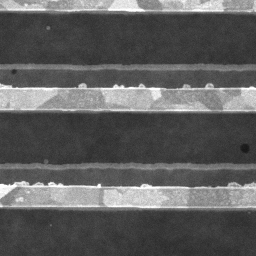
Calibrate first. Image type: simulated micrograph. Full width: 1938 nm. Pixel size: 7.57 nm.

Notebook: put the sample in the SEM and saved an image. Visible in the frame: lines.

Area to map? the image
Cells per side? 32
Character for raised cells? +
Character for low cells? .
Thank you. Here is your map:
++++++++++++++++++++++++++++++++
................................
................................
................................
................................
................................
................................
................................
+++++++++...+++.+++...+.+++.....
++++++++++++++++++++++++++++++++
++++++++++++++++++++++++++++++++
++++++++++++++++++++++++++++++++
++++++++++++++++++++++++++++++++
++++++++++++++++++++++++++++++++
................................
................................
................................
................................
................................
................................
................................
++++++++++++++++++++++++++++++++
++++++++++++++++++++++++++++++++
++++++++++++++++++++++++++++++++
++++++++++++++++++++++++++++++++
++++++++++++++++++++++++++++++++
................................
................................
................................
................................
................................
................................